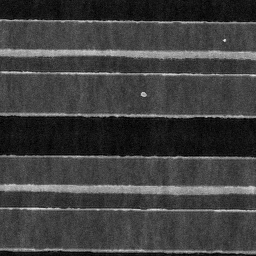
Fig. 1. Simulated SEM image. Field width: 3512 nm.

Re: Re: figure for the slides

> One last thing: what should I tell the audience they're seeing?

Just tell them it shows lines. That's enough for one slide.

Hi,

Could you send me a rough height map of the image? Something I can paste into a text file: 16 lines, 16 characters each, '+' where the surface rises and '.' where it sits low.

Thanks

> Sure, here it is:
................
++++++++++++++++
++++++++++++++++
++++++++++++++++
++++++++++++++++
++++++++++++++++
++++++++++++++++
................
................
................
++++++++++++++++
++++++++++++++++
++++++++++++++++
++++++++++++++++
++++++++++++++++
++++++++++++++++